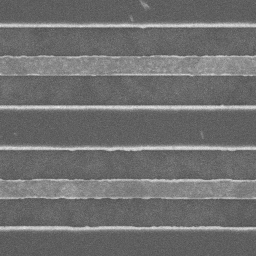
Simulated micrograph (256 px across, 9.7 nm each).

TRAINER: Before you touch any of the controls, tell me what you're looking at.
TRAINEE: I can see lines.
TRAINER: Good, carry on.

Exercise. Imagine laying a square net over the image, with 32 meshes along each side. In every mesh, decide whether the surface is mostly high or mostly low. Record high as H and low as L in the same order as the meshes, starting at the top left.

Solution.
HHHHHHHHHHHHHHHHHHHHHHHHHHHHHHHH
HHHHHHHHHHHHHHHHHHHHHHHHHHHHHHHH
HHHHHHHHHHHHHHHHHHHHHHHHHHHHHHHH
LLLLLLLLLLLLLLLLLLLLLLLLLLLLLLLL
LLLLLLLLLLLLLLLLLLLLLLLLLLLLLLLL
LLLLLLLLLLLLLLLLLLLLLLLLLLLLLLLL
LLLLLLLLLLLLLLLLLLLLLLLLLLLLLLLL
HHHHHHHHHHHHHHHHHHHHHHHHHHHHHHHH
HHHHHHHHHHHHHHHHHHHHHHHHHHHHHHHH
LLLLLLLLLLLLLLLLLLLLLLLLLLLLLLLL
LLLLLLLLLLLLLLLLLLLLLLLLLLLLLLLL
LLLLLLLLLLLLLLLLLLLLLLLLLLLLLLLL
LLLLLLLLLLLLLLLLLLLLLLLLLLLLLLLL
HHHHHHHHHHHHHHHHHHHHHHHHHHHHHHHH
HHHHHHHHHHHHHHHHHHHHHHHHHHHHHHHH
HHHHHHHHHHHHHHHHHHHHHHHHHHHHHHHH
HHHHHHHHHHHHHHHHHHHHHHHHHHHHHHHH
HHHHHHHHHHHHHHHHHHHHHHHHHHHHHHHH
HHHHHHHHHHHHHHHHHHHHHHHHHHHHHHHH
LLLLLLLLLLLLLLLLLLLLLLLLLLLLLLLL
LLLLLLLLLLLLLLLLLLLLLLLLLLLLLLLL
LLLLLLLLLLLLLLLLLLLLLLLLLLLLLLLL
HLLLHHHHHHLLLLHHHHHLLLHLHLLHHLLL
HHHHHHHHHHHHHHHHHHHHHHHHHHHHHHHH
HHHHHHHHHHHHHHHHHHHHHHHHHHHHHHHH
LLLLLLLLLLLLLLLLLLLLLLLLLLLLLLLL
LLLLLLLLLLLLLLLLLLLLLLLLLLLLLLLL
LLLLLLLLLLLLLLLLLLLLLLLLLLLLLLLL
HHHHHHHHHHHHHHHHHHHHHHHHHHHHHHHH
HHHHHHHHHHHHHHHHHHHHHHHHHHHHHHHH
HHHHHHHHHHHHHHHHHHHHHHHHHHHHHHHH
HHHHHHHHHHHHHHHHHHHHHHHHHHHHHHHH